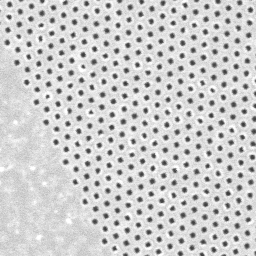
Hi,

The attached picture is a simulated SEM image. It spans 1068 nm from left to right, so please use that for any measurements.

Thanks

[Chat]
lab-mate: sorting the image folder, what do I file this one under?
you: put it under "a regular array of holes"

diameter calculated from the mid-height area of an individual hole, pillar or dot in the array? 0.0249 um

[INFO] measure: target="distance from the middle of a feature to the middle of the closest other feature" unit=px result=12.3